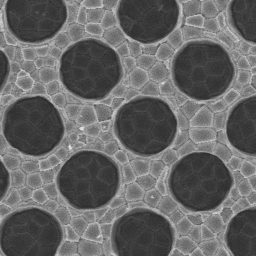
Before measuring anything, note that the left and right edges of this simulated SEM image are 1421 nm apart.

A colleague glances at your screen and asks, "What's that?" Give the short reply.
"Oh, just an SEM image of holes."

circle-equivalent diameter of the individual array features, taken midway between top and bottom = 334 nm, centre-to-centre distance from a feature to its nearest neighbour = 432 nm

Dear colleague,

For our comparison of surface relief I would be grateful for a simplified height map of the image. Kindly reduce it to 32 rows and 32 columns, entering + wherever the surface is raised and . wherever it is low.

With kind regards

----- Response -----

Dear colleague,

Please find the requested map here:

+.......+++++++.......+++++++...
+.......+++++++.......+++++++...
+.......+++++++.......+++++++...
+.......+++++++.......+++++++...
++.....+++++++++.....+++++++++..
+++++++++....++++++++++....+++++
++++++++......++++++++......++++
.+++++++.......+++++++.......+++
.+++++++.......+++++++.......+++
.+++++++.......+++++++.......+++
.+++++++.......+++++++.......+++
+++++++++.....+++++++++.....++++
++....+++++++++++...+++++.++++..
+......++++++++......++++++++...
+.......+++++++.......+++++++...
........++++++........++++++....
........++++++........++++++....
+.......+++++++.......+++++++...
++.....+++++++++.....++++++++...
++++.++++....++++++++++....+++++
++++++++.......+++++++......++++
.++++++........++++++........+++
.++++++........++++++........+++
.++++++........++++++........+++
++++++++......++++++++......++++
+++++++++....++++++++++....+++++
++....++++++++++...+++++++++++..
+......++++++++......++++++++...
........++++++.......+++++++....
........++++++........++++++....
.......+++++++........++++++....
.......+++++++.......++++++++...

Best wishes